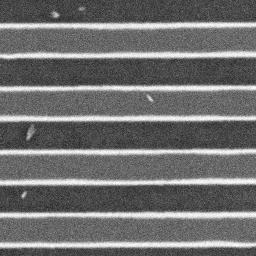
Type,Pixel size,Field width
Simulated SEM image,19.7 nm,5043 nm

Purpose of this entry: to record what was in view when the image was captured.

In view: lines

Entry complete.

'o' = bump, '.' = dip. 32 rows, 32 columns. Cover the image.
................................
................................
................................
oooooooooooooooooooooooooooooooo
oooooooooooooooooooooooooooooooo
oooooooooooooooooooooooooooooooo
oooooooooooooooooooooooooooooooo
................................
................................
................................
................................
oooooooooooooooooooooooooooooooo
oooooooooooooooooooooooooooooooo
oooooooooooooooooooooooooooooooo
oooooooooooooooooooooooooooooooo
................................
................................
................................
................................
oooooooooooooooooooooooooooooooo
oooooooooooooooooooooooooooooooo
oooooooooooooooooooooooooooooooo
oooooooooooooooooooooooooooooooo
................................
................................
................................
................................
oooooooooooooooooooooooooooooooo
oooooooooooooooooooooooooooooooo
oooooooooooooooooooooooooooooooo
oooooooooooooooooooooooooooooooo
................................